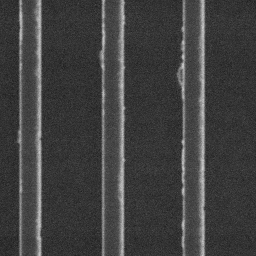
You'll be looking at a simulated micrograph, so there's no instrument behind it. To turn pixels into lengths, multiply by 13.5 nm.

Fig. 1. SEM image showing lines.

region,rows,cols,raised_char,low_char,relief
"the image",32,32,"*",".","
...**........**........**.......
...**........**........**.......
...**........**........**.......
...**........**........**.......
...**........**........**.......
...**........**........**.......
...**........**........**.......
...**........**........**.......
...**........**........**.......
...**........**........**.......
...**........**........**.......
...**........**........**.......
...**........**........**.......
...**........**........**.......
...**........**........**.......
...**........**........**.......
...**........**........**.......
...**........**........**.......
...**........**........**.......
...**........**........**.......
...**........**........**.......
...**........**........**.......
...**........**........**.......
...**........**........**.......
...**........**........**.......
...**........**........**.......
...**........**........**.......
...**........**........**.......
...**........**........**.......
...**........**........**.......
...**........**........**.......
...**........**........**.......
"